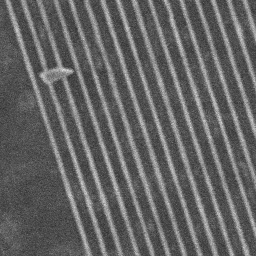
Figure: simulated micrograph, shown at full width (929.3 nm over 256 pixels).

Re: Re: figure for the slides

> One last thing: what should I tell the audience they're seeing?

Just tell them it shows parallel lines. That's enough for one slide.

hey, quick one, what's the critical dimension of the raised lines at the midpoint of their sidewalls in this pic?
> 12.5 nm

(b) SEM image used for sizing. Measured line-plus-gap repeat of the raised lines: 15.1 pixels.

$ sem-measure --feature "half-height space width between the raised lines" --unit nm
41